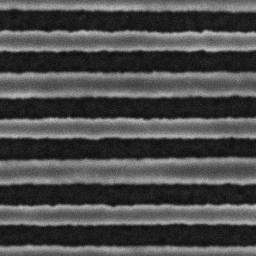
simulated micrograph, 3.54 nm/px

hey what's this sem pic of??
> lines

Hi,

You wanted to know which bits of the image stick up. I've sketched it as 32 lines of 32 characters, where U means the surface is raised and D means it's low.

UUUUUUUUUUUUUUUUUUUUUUUUUUUUUUUU
DDDDDDDDDDDDDDDDDDDDDDDDDDDDDDDD
DDDDDDDDDDDDDDDDDDDDDDDDDDDDDDDD
DDDDDDDDDDDDDDDDDDDDDDDDDDDDDDDD
UUUUUUUUUUUUUUUUUUUUUUUUUUUUUUUU
UUUUUUUUUUUUUUUUUUUUUUUUUUUUUUUU
DDDDDDDDDDDDDDDDDDDDDDDDDDDDDDDD
DDDDDDDDDDDDDDDDDDDDDDDDDDDDDDDD
DDDDDDDDDDDDDDDDDDDDDDDDDDDDDDDD
UUUUUUUUUUUUUUUUUUUUUUUUUUUUUUUU
UUUUUUUUUUUUUUUUUUUUUUUUUUUUUUUU
UUUUUUUUUUUUUUUUUUUUUUUUUUUUUUUU
DDDDDDDDDDDDDDDDDDDDDDDDDDDDDDDD
DDDDDDDDDDDDDDDDDDDDDDDDDDDDDDDD
DDDDDDDDDDDDDDDDDDDDDDDDDDDDDDDD
UUUUUUUUUUUUUUUUUUUUUUUUUUUUUUUU
UUUUUUUUUUUUUUUUUUUUUUUUUUUUUUUU
DDDDDDDDDDDDDDDDDDDDDDDDDDDDDDDD
DDDDDDDDDDDDDDDDDDDDDDDDDDDDDDDD
DDDDDDDDDDDDDDDDDDDDDDDDDDDDDDDD
UUUUUUUUUUUUUUUUUUUUUUUUUUUUUUUU
UUUUUUUUUUUUUUUUUUUUUUUUUUUUUUUU
UUUUUUUUUUUUUUUUUUUUUUUUUUUUUUUU
DDDDDDDDDDDDDDDDDDDDDDDDDDDDDDDD
DDDDDDDDDDDDDDDDDDDDDDDDDDDDDDDD
DDDDDDDDDDDDDDDDDDDDDDDDDDDDDDDD
UUUUUUUUUUUUUUUUUUUUUUUUUUUUUUUU
UUUUUUUUUUUUUUUUUUUUUUUUUUUUUUUU
DDDDDDDDDDDDDDDDDDDDDDDDDDDDDDDD
DDDDDDDDDDDDDDDDDDDDDDDDDDDDDDDD
DDDDDDDDDDDDDDDDDDDDDDDDDDDDDDDD
UUUUUUUUUUUUUUUUUUUUUUUUUUUUUUUU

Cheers